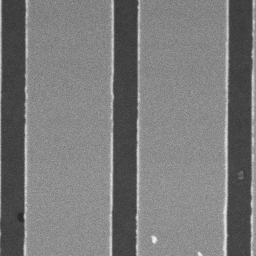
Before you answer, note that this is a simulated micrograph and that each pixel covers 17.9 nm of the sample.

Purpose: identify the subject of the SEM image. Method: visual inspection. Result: lines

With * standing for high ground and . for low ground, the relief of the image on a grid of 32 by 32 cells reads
...***********...***********....
...***********...***********....
...***********...***********....
...***********...***********....
...***********...***********....
...***********...***********....
...***********...***********....
...***********...***********....
...***********...***********....
...***********...***********....
...***********...***********....
...***********...***********....
...***********...***********....
...***********...***********....
...***********...***********....
...***********...***********....
...***********...***********....
...***********...***********....
...***********...***********....
...***********...***********....
...***********...***********....
...***********...***********....
...***********...***********....
...***********...***********...*
...***********...***********...*
...***********...***********...*
...***********...***********...*
...***********...***********...*
...***********...***********...*
...***********...***********...*
...***********...***********...*
...***********...***********...*